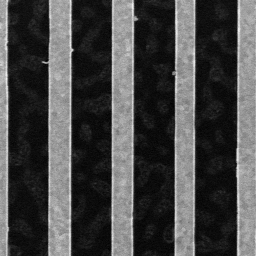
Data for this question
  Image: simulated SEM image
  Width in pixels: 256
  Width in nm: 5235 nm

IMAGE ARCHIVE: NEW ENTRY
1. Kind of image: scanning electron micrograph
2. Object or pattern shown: one or a few lines or trenches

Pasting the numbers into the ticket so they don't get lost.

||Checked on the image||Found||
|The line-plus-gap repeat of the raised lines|1280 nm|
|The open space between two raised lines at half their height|42.9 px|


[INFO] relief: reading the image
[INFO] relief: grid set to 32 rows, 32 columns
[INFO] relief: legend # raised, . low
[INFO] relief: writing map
#.....###.....###.....##......##
#.....###.....###.....##......##
#.....###.....###.....##......##
#.....###.....###.....##......##
#.....###.....###.....##......##
#.....###.....###.....##......##
#.....###.....###.....##......##
#.....###.....###.....##......##
#.....###.....###.....##......##
#.....###.....###.....##......##
#.....###.....###.....##......##
#.....###.....###.....##......##
#.....###.....###.....##......##
#.....###.....###.....##......##
#.....###.....###.....##......##
#.....###.....###.....##......##
#.....###.....###.....##......##
#.....###.....###.....##......##
#.....###.....###.....##......##
#.....###.....###.....##......##
#.....###.....###.....##......##
#.....###.....###.....##......##
#.....###.....###.....##......##
#.....###.....###.....##......##
#.....###.....##......##......##
#.....###.....##......##......##
#.....###.....##......##......##
#.....###.....##......##......##
#.....###.....##......##......##
#.....###.....##......##......##
#.....###.....##......##......##
#.....###.....##......##......##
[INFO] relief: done